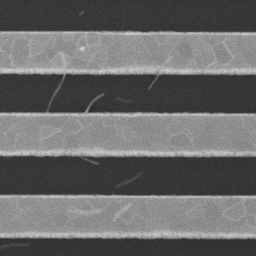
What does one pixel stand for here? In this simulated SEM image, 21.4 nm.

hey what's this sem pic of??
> lines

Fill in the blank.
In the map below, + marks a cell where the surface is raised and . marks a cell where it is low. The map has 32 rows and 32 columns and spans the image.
................................
................................
................................
................................
++++++++++++++++++++++++++++++++
++++++++++++++++++++++++++++++++
++++++++++++++++++++++++++++++++
++++++++++++++++++++++++++++++++
++++++++++++++++++++++++++++++++
................................
................................
................................
................................
................................
++++++++++++++++++++++++++++++++
++++++++++++++++++++++++++++++++
++++++++++++++++++++++++++++++++
++++++++++++++++++++++++++++++++
++++++++++++++++++++++++++++++++
...................++..+++..+++.
................................
................................
................................
................................
...++...........................
++++++++++++++++++++++++++++++++
++++++++++++++++++++++++++++++++
++++++++++++++++++++++++++++++++
++++++++++++++++++++++++++++++++
++++++++++++++++++++++++++++++++
................................
................................